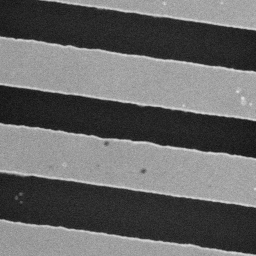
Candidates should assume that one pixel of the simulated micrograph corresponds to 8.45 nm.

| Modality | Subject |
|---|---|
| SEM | lines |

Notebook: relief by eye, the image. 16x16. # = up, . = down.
......##########
.............###
##..............
#########.......
################
.###############
........########
................
######..........
#############...
################
......##########
.............###
................
######..........
#############...